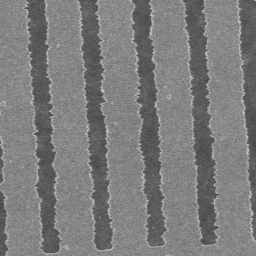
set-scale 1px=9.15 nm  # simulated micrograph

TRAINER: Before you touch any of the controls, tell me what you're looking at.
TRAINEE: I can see parallel lines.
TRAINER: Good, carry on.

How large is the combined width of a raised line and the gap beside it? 52.8 pixels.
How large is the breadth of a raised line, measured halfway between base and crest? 318 nanometers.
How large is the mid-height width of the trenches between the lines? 162 nm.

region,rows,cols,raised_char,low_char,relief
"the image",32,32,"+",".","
+++...++++..+++++..++++...++++..
+++...++++..+++++..++++..+++++..
+++...++++..+++++..++++...++++..
+++...++++...++++..++++...++++..
++++..++++..+++++..+++++..++++..
++++..++++...++++..+++++..++++..
++++..++++...++++..+++++..++++..
++++..++++...++++..+++++..++++..
++++..+++++..++++..+++++..++++..
++++..++++...++++..+++++..++++..
++++..+++++..++++..+++++..++++..
++++..+++++..++++...++++..++++..
++++..+++++..++++...++++..++++..
++++..+++++..++++...++++..+++++.
++++...++++..+++++..++++..+++++.
++++...++++..+++++..++++..+++++.
++++...++++..+++++..++++..+++++.
++++..+++++..++++...++++...++++.
+++++..++++..++++...++++...++++.
+++++..++++..+++++..++++...++++.
+++++..++++..+++++..++++...++++.
+++++..++++...++++..+++++..++++.
+++++..++++...++++..+++++..++++.
++++...+++++..++++..+++++..++++.
.++++..++++...++++..+++++..++++.
.++++..+++++..++++..+++++..++++.
.++++..++++...++++..+++++..++++.
.++++..+++++..++++...++++..++++.
.++++..+++++..++++...++++..++++.
.++++..+++++..++++..+++++..+++++
.++++...++++..+++++.+++++..+++++
.+++++.+++++++++++++++++++++++++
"